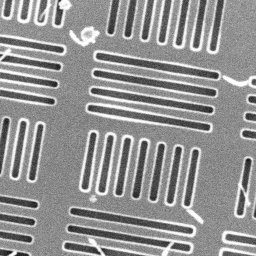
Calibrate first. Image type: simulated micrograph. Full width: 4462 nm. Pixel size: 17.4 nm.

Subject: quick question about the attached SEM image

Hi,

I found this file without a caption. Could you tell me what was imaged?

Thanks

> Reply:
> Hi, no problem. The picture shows groups of lines, slits or small figures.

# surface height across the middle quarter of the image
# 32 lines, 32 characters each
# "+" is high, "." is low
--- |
+++++++++++++++++.............++
++++++++..+++++++++++++.........
+++++++........+++++++++++++....
+++++++++............+++++++++++
++++++++++++++...............+++
+++++++++++++++++++++...........
+++++++.......+++++++++++++.....
+++++++...........++++++++++++++
+++++++++++..............+++++++
+++++++++++++++++.............++
++++++.....+++++++++++++........
++++++...........+++++++++++++..
+++++++++.............++++++++++
+++++++++++++...............++++
++++++++++++++++++++............
++++++++++++++++++++++++++++....
++++++++++++++++++++++++++++++++
++++++..+++.++++++++++++++++++++
++++++..+++..++..+++++++++++++++
++++++..++...++..++..+++++++++++
++++++..++..+++..++..++..+++.+++
++++++..++..++...++..++..+++..++
++++++..++..++..+++..++..+++..++
+++++...++..++..+++..++..++..+++
+++++..+++..++..++..+++..++..++.
+++++..++...++..++..++...++..++.
+++++..++...+...++..++..+++..++.
++++...++..++..+++..++..+++..++.
++++...++..++..+++..++..++...++.
++++...+...++..++...++..++..+++.
++++...+...++..++..+++..++..++..
+++++.++...++..++..++...++..++..